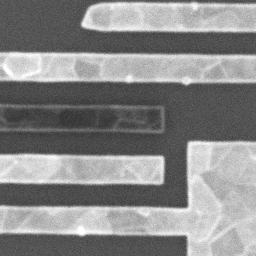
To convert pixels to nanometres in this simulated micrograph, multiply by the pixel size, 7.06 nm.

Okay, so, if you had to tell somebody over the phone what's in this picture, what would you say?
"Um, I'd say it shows wiring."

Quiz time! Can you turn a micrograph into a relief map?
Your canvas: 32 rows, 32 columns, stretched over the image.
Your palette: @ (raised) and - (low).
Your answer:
------------------------@-------
-----------@@@@@@@@@@@@@@@@@@@@@
----------@@@@@@@@@@@@@@@@@@@@@@
-----------@@@@@@@@@@@@@@@@@@@@@
--------------------------------
--------------------------------
--------------------------------
@@@@@@@@@@@@@@@@@@@@@@@@@@@@@@@@
@@@@@@@@@@@@@@@@@@@@@@@@@@@@@@@@
@@@@@@@@@@@@@@@@@@@@@@@@@@@@@@@@
--------------------------------
--------------------------------
--------------------------------
@@@@@@@@@@@@@@@@@@@@------------
@@@@@@@@@@@@@@@@@@@@------------
@@@@@@@@@@@@@@@@@@@@------------
--------------------------------
--------------------------------
------------------------@@@@@@@@
@@@@@@@-----------------@@@@@@@@
@@@@@@@@@@@@@@@@@@@@----@@@@@@@@
@@@@@@@@@@@@@@@@@@@@----@@@@@@@@
@@@@@@@@@@@@@@@@@@@@----@@@@@@@@
------------------------@@@@@@@@
------------------------@@@@@@@@
------------------------@@@@@@@@
@@@@@@@@@@@@@@@@@@@@@@@@@@@@@@@@
@@@@@@@@@@@@@@@@@@@@@@@@@@@@@@@@
@@@@@@@@@@@@@@@@@@@@@@@@@@@@@@@@
-----------------------@@@@@@@@@
------------------------@@@@@@@@
------------------------@@@@@@@@